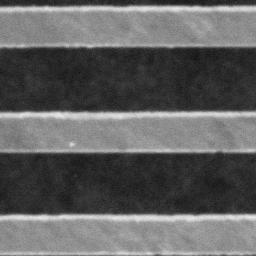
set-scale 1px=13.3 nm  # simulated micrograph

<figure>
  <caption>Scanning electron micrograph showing lines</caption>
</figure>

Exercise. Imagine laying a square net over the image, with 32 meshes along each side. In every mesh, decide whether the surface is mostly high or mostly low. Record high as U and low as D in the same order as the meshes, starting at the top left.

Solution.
DDDDDDDDDDDDDDDDDDDDDDDDDDDDDDDD
UUUUUUUUUUUUUUUUUUUUUUUUUUUUUUUU
UUUUUUUUUUUUUUUUUUUUUUUUUUUUUUUU
UUUUUUUUUUUUUUUUUUUUUUUUUUUUUUUU
UUUUUUUUUUUUUUUUUUUUUUUUUUUUUUUU
UUUUUUUUUUUUUUUUUUUUUUUUUUUUUUUU
DDDDDDDDDDDDDDDDDDDDDDDDDDDDDDDD
DDDDDDDDDDDDDDDDDDDDDDDDDDDDDDDD
DDDDDDDDDDDDDDDDDDDDDDDDDDDDDDDD
DDDDDDDDDDDDDDDDDDDDDDDDDDDDDDDD
DDDDDDDDDDDDDDDDDDDDDDDDDDDDDDDD
DDDDDDDDDDDDDDDDDDDDDDDDDDDDDDDD
DDDDDDDDDDDDDDDDDDDDDDDDDDDDDDDD
DDDDDDDDDDDDDDDDDDDDDDDDDDDDDDDD
UUUUUUUUUUUUUUUUUUUUUUUUUUUUUUUU
UUUUUUUUUUUUUUUUUUUUUUUUUUUUUUUU
UUUUUUUUUUUUUUUUUUUUUUUUUUUUUUUU
UUUUUUUUUUUUUUUUUUUUUUUUUUUUUUUU
UUUUUUUUUUUUUUUUUUUUUUUUUUUUUUUU
DDDDDDDDDDDDDDDDDDDDDDDDDDDDDDDD
DDDDDDDDDDDDDDDDDDDDDDDDDDDDDDDD
DDDDDDDDDDDDDDDDDDDDDDDDDDDDDDDD
DDDDDDDDDDDDDDDDDDDDDDDDDDDDDDDD
DDDDDDDDDDDDDDDDDDDDDDDDDDDDDDDD
DDDDDDDDDDDDDDDDDDDDDDDDDDDDDDDD
DDDDDDDDDDDDDDDDDDDDDDDDDDDDDDDD
DDDDDDDDDDDDDDDDDDDDDDDDDDDDDDDD
UUUUUUUUUUUUUUUUUUUUUUUUUUUUUUUU
UUUUUUUUUUUUUUUUUUUUUUUUUUUUUUUU
UUUUUUUUUUUUUUUUUUUUUUUUUUUUUUUU
UUUUUUUUUUUUUUUUUUUUUUUUUUUUUUUU
UUUUUUUUUUUUUUUUUUUUUUUUUUUUUUUU